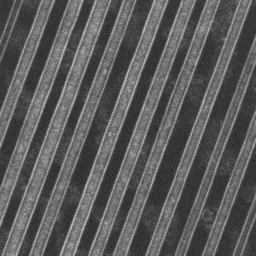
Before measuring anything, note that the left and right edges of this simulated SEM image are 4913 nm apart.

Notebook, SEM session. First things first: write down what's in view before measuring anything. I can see parallel lines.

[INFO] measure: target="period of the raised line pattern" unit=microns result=0.511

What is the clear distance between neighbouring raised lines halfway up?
205 nm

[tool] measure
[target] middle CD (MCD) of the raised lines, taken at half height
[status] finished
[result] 293 nm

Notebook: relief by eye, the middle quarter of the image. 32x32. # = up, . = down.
##....###...#####...####...###..
##...####..#####...####...####..
#....###...#####...####...###...
#....###...####....####..####...
#...###...#####...####...###...#
....###...#####...####...###...#
...####...####...####...####...#
...###...#####...####...###...##
...###...#####...####...###...##
..####..#####...####...###...###
..###...#####...####...###...###
..###...####....####...###...###
.####..#####...####...###...####
.###...#####...####...###...####
####...####....####..####...####
###...#####...####...###...#####
###...#####...####...###...#####
###...####...####...####...#####
##...#####...####...###...#####.
##...#####...####...###...#####.
##..#####...####...####..######.
#...#####...####...###...#####..
#...####....####...###...#####..
...#####...####...###...######..
...#####...####...###...#####...
...####....####...###..######..#
..#####...####...###...#####...#
..#####...####...###...#####...#
.#####...####...####..######..##
.#####...####...###...######..##
.#####...####...###...#####...##
#####...####...###...######..###